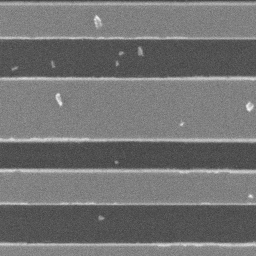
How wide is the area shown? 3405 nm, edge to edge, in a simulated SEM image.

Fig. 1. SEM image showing lines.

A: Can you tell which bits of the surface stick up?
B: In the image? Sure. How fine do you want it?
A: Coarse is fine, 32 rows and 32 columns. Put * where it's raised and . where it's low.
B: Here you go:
.***.........**..*.......******.
********************************
********************************
********************************
********************************
................................
................................
................................
................................
................................
********************************
********************************
********************************
********************************
********************************
********************************
********************************
........................**......
................................
................................
................................
********************************
********************************
********************************
********************************
*.******************************
................................
................................
................................
................................
................................
********************************